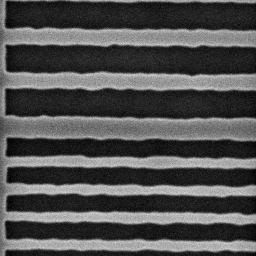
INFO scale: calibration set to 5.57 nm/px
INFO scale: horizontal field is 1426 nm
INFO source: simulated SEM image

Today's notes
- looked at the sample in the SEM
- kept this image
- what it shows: groups of lines, slits or small figures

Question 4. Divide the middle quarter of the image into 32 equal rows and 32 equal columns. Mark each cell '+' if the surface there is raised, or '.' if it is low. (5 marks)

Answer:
................................
................................
+++....+++++....................
++++++++++++++++++++++++++++++++
++++++++++++++++++++++++++++++++
++++++++++++++++++++++++++++++++
................................
................................
................................
................................
................................
................................
................................
+++++...........................
++++++++++++++++++++++++++++++++
++++++++++++++++++++++++++++++++
++++++++++++++++++++++++++++++++
++++++++++++++++++++++++++++++++
.......++++...++++++++..++++++++
................................
................................
................................
................................
++++++......+........+++++++....
++++++++++++++++++++++++++++++++
....+++++..++...++++++++++++++++
................................
................................
................................
................................
+++++++++++..++++++.............
++++++++++++++++++++++++++++++++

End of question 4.